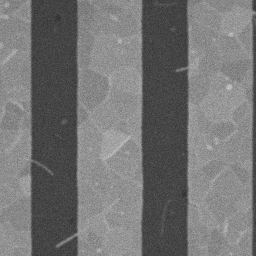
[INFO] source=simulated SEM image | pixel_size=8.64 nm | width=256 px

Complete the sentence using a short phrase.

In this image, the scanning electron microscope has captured wiring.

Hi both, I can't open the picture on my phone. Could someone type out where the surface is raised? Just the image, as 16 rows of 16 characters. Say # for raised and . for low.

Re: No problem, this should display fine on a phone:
##...####...####
##...####...####
##...####...####
##...####...####
##...####...####
##...####...####
##...####...####
##...####...####
##...####...####
##...####...####
##...####...####
##...####...####
##...####...####
##...####...####
##...####...####
##...####...####